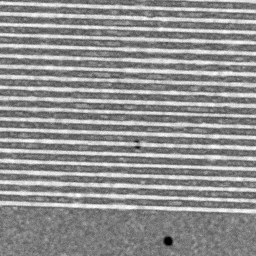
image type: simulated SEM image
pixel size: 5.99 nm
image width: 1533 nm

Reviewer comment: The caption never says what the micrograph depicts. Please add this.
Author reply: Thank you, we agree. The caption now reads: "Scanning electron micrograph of parallel lines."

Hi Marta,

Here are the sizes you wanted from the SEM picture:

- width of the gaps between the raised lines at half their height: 8.13 pixels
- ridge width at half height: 0.0165 µm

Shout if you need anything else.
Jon